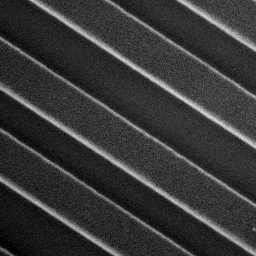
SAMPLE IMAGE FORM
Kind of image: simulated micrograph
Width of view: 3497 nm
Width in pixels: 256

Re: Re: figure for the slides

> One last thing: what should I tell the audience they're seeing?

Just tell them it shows lines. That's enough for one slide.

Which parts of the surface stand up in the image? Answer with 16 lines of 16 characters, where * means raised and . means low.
...*****....****
....*****.....**
......*****....*
**.....*****....
***......*****..
*****.....*****.
..****......****
...*****.....***
*....****......*
**....*****.....
****....****....
*****....*****..
..*****....*****
...*****....****
.....*****....**
.......****....*